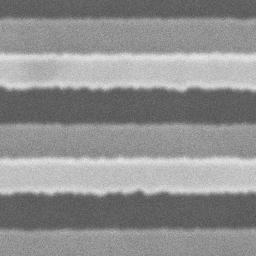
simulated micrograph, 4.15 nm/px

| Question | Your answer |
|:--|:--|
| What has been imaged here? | lines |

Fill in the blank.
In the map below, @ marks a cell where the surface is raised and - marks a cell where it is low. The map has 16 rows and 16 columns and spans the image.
----------------
@@@@@@@@@@@@@@@@
@@@@@@@@@@@@@@@@
@@@@@@@@@@@@@@@@
@@@@@@@@@@@@@@@@
-@---------@---@
----------------
----------------
@@@@@@@@@@@@@@@@
@@@@@@@@@@@@@@@@
@@@@@@@@@@@@@@@@
@@@@@@@@@@@@@@@@
----------------
----------------
@@@@@@@@@@@@@@@@
@@@@@@@@@@@@@@@@